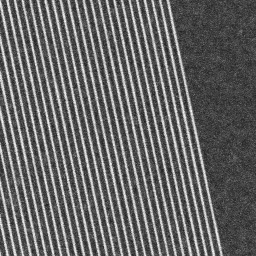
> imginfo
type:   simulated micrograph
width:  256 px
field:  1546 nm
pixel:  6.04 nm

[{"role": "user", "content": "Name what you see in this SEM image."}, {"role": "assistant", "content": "parallel lines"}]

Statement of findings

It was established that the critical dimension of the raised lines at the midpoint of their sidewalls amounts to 0.0089 µm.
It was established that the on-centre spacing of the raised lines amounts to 45.2 nanometers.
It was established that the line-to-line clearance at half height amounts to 5.88 pixels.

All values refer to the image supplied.